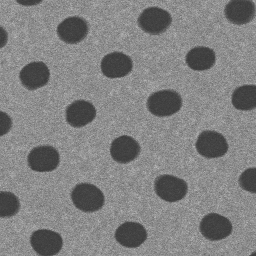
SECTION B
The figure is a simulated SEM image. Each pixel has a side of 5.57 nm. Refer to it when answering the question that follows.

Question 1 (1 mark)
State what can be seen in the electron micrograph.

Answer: a regular array of holes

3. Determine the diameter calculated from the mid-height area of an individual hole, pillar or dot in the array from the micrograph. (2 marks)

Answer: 28.8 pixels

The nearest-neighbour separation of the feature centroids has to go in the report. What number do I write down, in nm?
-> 319